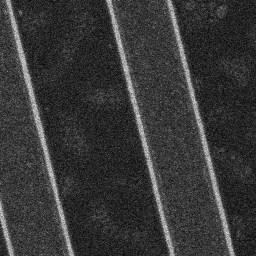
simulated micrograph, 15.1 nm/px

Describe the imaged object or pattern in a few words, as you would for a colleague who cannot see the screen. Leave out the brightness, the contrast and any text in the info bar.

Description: one or a few lines or trenches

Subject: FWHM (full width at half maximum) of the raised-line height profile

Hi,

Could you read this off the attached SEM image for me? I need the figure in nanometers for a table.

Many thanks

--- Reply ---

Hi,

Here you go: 891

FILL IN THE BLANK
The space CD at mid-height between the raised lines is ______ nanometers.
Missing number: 1470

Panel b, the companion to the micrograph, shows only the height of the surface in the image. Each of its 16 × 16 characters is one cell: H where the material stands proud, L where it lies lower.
HLLLLLLHHHHLLLLL
HLLLLLLHHHHLLLLL
HLLLLLLHHHHLLLLL
HLLLLLLLHHHLLLLL
HHLLLLLLHHHHLLLL
HHLLLLLLHHHHLLLL
HHLLLLLLHHHHLLLL
HHLLLLLLLHHHLLLL
HHHLLLLLLHHHHLLL
HHHLLLLLLHHHHLLL
HHHLLLLLLHHHHLLL
HHHLLLLLLLHHHLLL
HHHHLLLLLLHHHHLL
HHHHLLLLLLHHHHLL
HHHHLLLLLLHHHHLL
LHHHLLLLLLLHHHLL